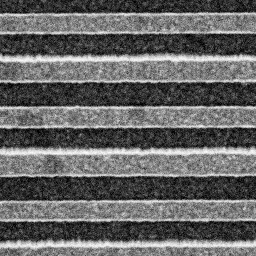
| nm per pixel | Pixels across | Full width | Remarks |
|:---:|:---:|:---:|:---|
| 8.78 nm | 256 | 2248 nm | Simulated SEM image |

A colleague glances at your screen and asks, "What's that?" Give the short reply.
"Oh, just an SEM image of lines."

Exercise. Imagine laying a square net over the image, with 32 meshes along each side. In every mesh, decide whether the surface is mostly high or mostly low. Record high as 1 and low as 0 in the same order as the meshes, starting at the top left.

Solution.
00000000000000000000000000000000
00000000000000000000000000000000
11111111111111111111111111111111
11111111111111111111111111111111
00000000000000000000000000000000
00000000000000000000000000000000
00000000000000000000000000000000
11111111111111111111111111111111
11111111111111111111111111111111
11111111111111111111111111111111
00000000000000000000000000000000
00000000000000000000000000000000
00000000000000000000000000000000
11111111111111111111111111111111
11111111111111111111111111111111
11111111111111111111111111111111
00000000000000000000000000000000
00000000000000000000000000000000
00000000000000000000000000000000
11111111111111111111111111111111
11111111111111111111111111111111
11111111111111111111111111111111
00000000000000000000000000000000
00000000000000000000000000000000
00000000000000000000000000000000
11111111111111111111111111111111
11111111111111111111111111111111
11111111111111111111111111111111
00000000000000000000000000000000
00000000000000000000000000000000
00000000000000000000000000000000
11111111111111111111111111111111